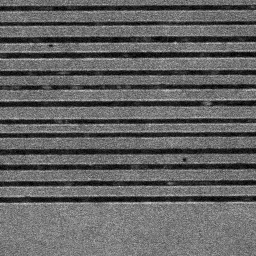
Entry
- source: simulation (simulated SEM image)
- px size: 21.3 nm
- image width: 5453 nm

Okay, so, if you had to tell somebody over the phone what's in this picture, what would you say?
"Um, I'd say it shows parallel lines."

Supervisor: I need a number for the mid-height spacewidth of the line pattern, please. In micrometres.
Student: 0.192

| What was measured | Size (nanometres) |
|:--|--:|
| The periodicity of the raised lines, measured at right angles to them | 340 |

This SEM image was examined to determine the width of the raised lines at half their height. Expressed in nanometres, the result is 152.